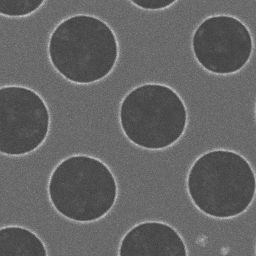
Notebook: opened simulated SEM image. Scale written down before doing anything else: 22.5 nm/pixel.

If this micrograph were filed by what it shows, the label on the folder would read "holes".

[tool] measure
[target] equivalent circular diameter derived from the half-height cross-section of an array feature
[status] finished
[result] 1470 nm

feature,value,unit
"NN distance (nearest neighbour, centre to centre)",2.21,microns